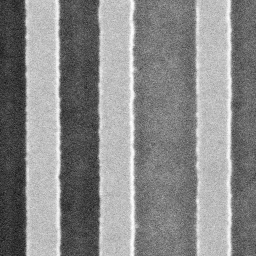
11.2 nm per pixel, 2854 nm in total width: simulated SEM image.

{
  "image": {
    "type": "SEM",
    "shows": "lines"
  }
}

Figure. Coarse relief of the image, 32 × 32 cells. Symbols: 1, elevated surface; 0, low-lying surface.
00011110000001111000000001111000
00011110000011110000000001111000
00011110000011110000000001111000
00011110000001111000000001111000
00011110000001110000000001111000
00011110000001110000000001111000
00011110000001110000000001111000
00011110000001110000000001111000
00011110000001110000000001111000
00011110000001110000000001111000
00011110000001110000000001111000
00011110000001111000000001111000
00011110000001110000000001111000
00011110000011110000000001111000
00011110000001110000000001111000
00011110000001110000000001111000
00011110000011111000000001111000
00011110000001111000000001111000
00011110000001111000000001111000
00011110000011111000000001111000
00011110000001111000000001111000
00011110000001111000000001111000
00011110000001111000000001111000
00011110000001111000000001111000
00011110000001111000000001111000
00011110000001111000000001111000
00011110000001111000000001111000
00011110000001111000000001111000
00011110000001111000000001111000
00011110000001111000000001111000
00011110000001111000000001111000
00011110000001111000000001111000